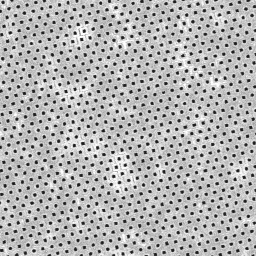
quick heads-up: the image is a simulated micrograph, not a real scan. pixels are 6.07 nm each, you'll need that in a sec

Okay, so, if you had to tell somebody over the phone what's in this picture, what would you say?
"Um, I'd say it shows a regular array of holes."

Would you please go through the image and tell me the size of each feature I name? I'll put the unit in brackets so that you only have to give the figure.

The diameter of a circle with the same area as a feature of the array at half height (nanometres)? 22.7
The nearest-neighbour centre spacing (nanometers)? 52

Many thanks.